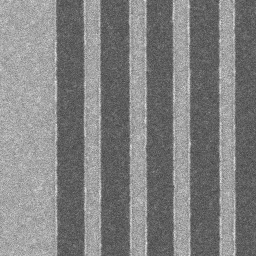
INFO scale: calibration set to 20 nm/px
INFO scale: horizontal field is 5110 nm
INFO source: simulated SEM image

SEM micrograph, parallel lines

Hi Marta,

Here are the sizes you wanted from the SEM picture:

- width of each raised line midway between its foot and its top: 611 nanometers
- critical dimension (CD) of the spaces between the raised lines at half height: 280 nanometres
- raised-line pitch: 44.8 px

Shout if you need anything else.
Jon